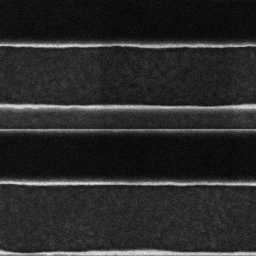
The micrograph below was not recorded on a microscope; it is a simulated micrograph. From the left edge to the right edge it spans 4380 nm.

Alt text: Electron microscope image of lines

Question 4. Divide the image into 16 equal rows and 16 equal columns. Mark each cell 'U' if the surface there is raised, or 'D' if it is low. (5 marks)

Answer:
UUUUUUUUUUUUUUUU
UUUUUUUUUUUUUUUU
UUUUUUUUUUUUUUUU
DDDDDDDDDDDDDDDD
DDDDDDDDDDDDDDDD
DDDDDDDDDDDDDDDD
DDDDDDDDDDDDDDDD
UUUUUUUUUUUUUUUU
UUUUUUUUUUUUUUUU
UUUUUUUUUUUUUUUU
UUUUUUUUUUUUUUUU
DDDDDDDDDDDDDDDD
DDDDDDDDDDDDDDDD
DDDDDDDDDDDDDDDD
DDDDDDDDDDDDDDDD
DDDDDDDDDDDDDDDD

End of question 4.